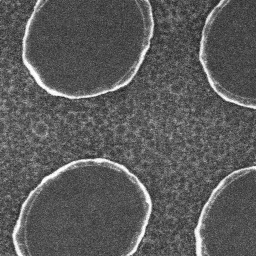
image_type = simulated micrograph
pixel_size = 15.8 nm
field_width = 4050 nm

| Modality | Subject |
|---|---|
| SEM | raised bodies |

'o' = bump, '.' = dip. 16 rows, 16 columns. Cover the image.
..ooooooo....ooo
..oooooooo...ooo
..ooooooo....ooo
.oooooooo....ooo
..oooooo.....ooo
...oooo......ooo
...............o
................
................
................
....oooo........
...oooooo.....oo
..ooooooo....ooo
.oooooooo....ooo
.oooooooo...oooo
.ooooooo....oooo